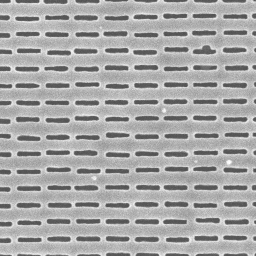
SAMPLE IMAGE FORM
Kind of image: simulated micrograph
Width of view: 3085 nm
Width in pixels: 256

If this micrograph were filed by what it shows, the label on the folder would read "a regular array of holes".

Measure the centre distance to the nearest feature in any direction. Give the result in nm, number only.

198